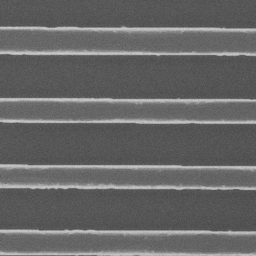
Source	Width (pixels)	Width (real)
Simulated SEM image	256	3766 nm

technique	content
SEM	lines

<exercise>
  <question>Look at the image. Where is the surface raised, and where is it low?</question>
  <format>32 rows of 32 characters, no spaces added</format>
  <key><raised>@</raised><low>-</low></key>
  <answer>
--------------------------------
--------------------------------
--------------------------------
@@@@@@--------------------------
@@@@@@@@@@@@@@@@@@@@@@@@@@@@@@@@
@@@@@@@@@@@@@@@@@@@@@@@@@@@@@@@@
@@@@@@@@@@@@@@@@@@@@@@@@@@@@@@@@
--------------------------------
--------------------------------
--------------------------------
--------------------------------
--------------------------------
@@@@@@@@@@@@@@@@@@@@@@@@@@@@@@@-
@@@@@@@@@@@@@@@@@@@@@@@@@@@@@@@@
@@@@@@@@@@@@@@@@@@@@@@@@@@@@@@@@
--------------------------------
--------------------------------
--------------------------------
--------------------------------
--------------------------------
--------------------------------
@@@@@@@@@@@@@@@@@@@@@@@@@@@@@@@@
@@@@@@@@@@@@@@@@@@@@@@@@@@@@@@@@
--------------@@@@@@@@@@@@@@@@@@
--------------------------------
--------------------------------
--------------------------------
--------------------------------
--------------------------------
@@@@@@@@@@@@@@@@@@@@@@@@@@@@@@@@
@@@@@@@@@@@@@@@@@@@@@@@@@@@@@@@@
@@@@@@@@@@@@@@@@@@@@@@@@@@@@@@@@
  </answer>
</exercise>